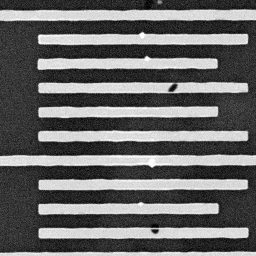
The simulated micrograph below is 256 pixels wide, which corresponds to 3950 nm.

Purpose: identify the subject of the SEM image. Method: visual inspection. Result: groups of lines, slits or small figures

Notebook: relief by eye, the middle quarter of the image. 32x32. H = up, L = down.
HHHHHHHHHHHHHHHHHHHHHHHHHHHHHHHH
LLLLLLLLLLLLLLLLLLLLLLLLLLLLLLLL
LLLLLLLLLLLLLLLLLLLLLLLLLLLLLLLL
LLLLLLLLLLLLLLLLLLLLLLLLLLLLLLLL
LLLLLLLLLLLLLLLLLLLLLLLLLLLLLLLL
HHHHHHHHHHHHHHHHHHHHHHHHHHHHHHHH
HHHHHHHHHHHHHHHHHHHHHHHHHHHHHHHH
LLLLLLLLLLLLLLLLLLLLLLLLLLLLLLLL
LLLLLLLLLLLLLLLLLLLLLLLLLLLLLLLL
LLLLLLLLLLLLLLLLLLLLLLLLLLLLLLLL
LLLLLLLLLLLLLLLLLLLLLLLLLLLLLLLL
HHHHHHHHHHHHHHHHHHHHHHHHHHHHHHHH
HHHHHHHHHHHHHHHHHHHHHHHHHHHHHHHH
LLLLLLLLLLLLLLLLLLLLLLLLLLLLLLLL
LLLLLLLLLLLLLLLLLLLLLLLLLLLLLLLL
LLLLLLLLLLLLLLLLLLLLLLLLLLLLLLLL
LLLLLLLLLLLLLLLLLLLLLLLLLLLLLLLL
HHHHHHHHHHHHHHHHHHHHHHHHHHHHHHHH
HHHHHHHHHHHHHHHHHHHHHHHHHHHHHHHH
LLLLLLLLLLLLLLLLLLLLLLLLLLLLLLLL
LLLLLLLLLLLLLLLLLLLLLLLLLLLLLLLL
LLLLLLLLLLLLLLLLLLLLLLLLLLLLLLLL
LLLLLLLLLLLLLLLLLLLLLLLLLLLLLLLL
HHHHHHHHHHHHHHHHHHHHHHHHHHHHHHHH
HHHHHHHHHHHHHHHHHHHHHHHHHHHHHHHH
LLLLLLLLLLLLLLLLLLLLLLLLLLLLLLLL
LLLLLLLLLLLLLLLLLLLLLLLLLLLLLLLL
LLLLLLLLLLLLLLLLLLLLLLLLLLLLLLLL
LLLLLLLLLLLLLLLLLLLLLLLLLLLLLLLL
HHHHHHHHHHHHHHHHHHHHHHHHHHHHHHHH
HHHHHHHHHHHHHHHHHHHHHHHHHHHHHHHH
LLLLLLLLLLLLLLLLLLLLLLLLLLLLLLLL